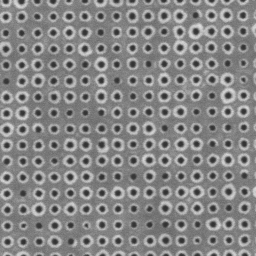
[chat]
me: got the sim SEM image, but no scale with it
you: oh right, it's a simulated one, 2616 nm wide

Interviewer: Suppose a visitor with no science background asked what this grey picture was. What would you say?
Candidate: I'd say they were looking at a regular array of holes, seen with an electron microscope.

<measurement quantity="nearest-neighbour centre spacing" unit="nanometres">160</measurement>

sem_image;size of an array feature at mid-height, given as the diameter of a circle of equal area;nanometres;65.2